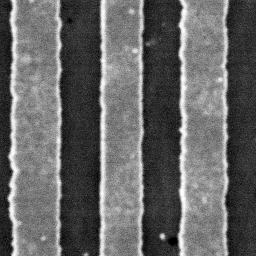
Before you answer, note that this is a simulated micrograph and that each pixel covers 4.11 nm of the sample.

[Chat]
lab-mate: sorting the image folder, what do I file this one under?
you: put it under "lines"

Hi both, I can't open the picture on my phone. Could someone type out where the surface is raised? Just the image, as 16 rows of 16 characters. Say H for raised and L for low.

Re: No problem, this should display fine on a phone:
LHHHLLHHHLLHHHLL
LHHHLLHHHLLHHHLL
LHHHLLHHHLLHHHLL
LHHHLLHHHLLHHHLL
LHHHLLHHHLLHHHLL
LHHHLLHHHLLHHHLL
LHHHLLHHHLLHHHLL
LHHHLLHHHLLHHHLL
LHHHLLHHHLLHHHLL
LHHHLLHHHLLHHHLL
LHHHLLHHHLLHHHLL
LHHHLLHHHLLHHHLL
LHHHLLHHHLLHHHLL
LHHHLLHHHLLHHHLL
LHHHLLHHHLLHHHLL
LHHHLLHHHLLHHHLL